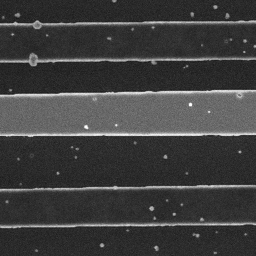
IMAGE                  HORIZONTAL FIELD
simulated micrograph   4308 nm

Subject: lines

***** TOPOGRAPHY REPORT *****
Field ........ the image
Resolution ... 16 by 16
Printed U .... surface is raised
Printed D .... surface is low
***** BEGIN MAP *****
DDDDDDDDDDDDDDDD
UUUUUUUUUUUUUUUU
UUUUUUUUUUUUUUUU
UUUUUUUUUUUUUUUU
DDDDDDDDDDDDDDDD
DDDDDDDDDDDDDDDD
UUUUUUUUUUUUUUUU
UUUUUUUUUUUUUUUU
DDDDDDDDDDDDDDDD
DDDDDDDDDDDDDDDD
DDDDDDDDDDDDDDDD
DDDDDDDDDDDDDDDD
UUUUUUUUUUUUUUUU
UUUUUUUUUUUUUUUU
DDDDDDDDDDDDDDDD
DDDDDDDDDDDDDDDD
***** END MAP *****